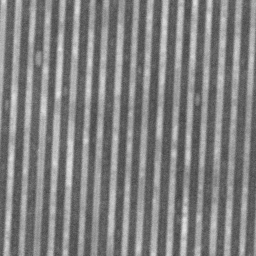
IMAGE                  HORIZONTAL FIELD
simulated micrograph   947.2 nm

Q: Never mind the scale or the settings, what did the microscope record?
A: parallel lines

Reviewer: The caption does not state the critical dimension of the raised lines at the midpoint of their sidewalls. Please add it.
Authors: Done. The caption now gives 13.8 nm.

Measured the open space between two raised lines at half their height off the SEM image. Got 41.1 nm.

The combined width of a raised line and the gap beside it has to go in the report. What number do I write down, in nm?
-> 54.3